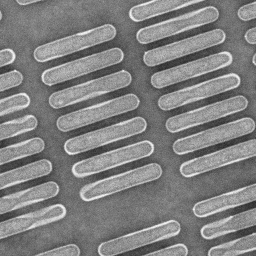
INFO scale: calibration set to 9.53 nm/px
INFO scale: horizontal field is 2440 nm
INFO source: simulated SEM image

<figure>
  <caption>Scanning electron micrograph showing groups of lines, slits or small figures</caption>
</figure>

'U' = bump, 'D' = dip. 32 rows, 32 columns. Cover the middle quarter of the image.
UUUUUUUUUUUDDDDDDDDDDDDDDDDDDUUU
UUUUUUUUDDDDDDDDDDDDDDDDDDUUUUUU
UUUUUDDDDDDDUUUUDDDDDDDUUUUUUUUU
UUDDDDDDDUUUUUUUUDDDDDUUUUUUUUUU
DDDDDDDUUUUUUUUUUDDDDDUUUUUUUDDD
DDDDUUUUUUUUUUUDDDDDDDDUUUDDDDDD
UUUUUUUUUUUUUDDDDDDDDDDDDDDDDDUU
UUUUUUUUDDDDDDDDDDDDDDDDDDUUUUUU
UUUUUDDDDDDDDDUUUUDDDDDDUUUUUUUU
UUUDDDDDDDDUUUUUUUUDDDDDUUUUUUUD
DDDDDDDDDUUUUUUUUUDDDDDDUUUUUDDD
DDDDUUUUUUUUUUUUUDDDDDDDDDDDDDDD
DUUUUUUUUUUUUUDDDDDDDDDDDDDDDDUU
UUUUUUUUUUUDDDDDDDUDDDDDDDDUUUUU
UUUUUUUUDDDDDDDDUUUUDDDDDDUUUUUU
UUUUUDDDDDDDUUUUUUUUDDDDDDUUUUUU
UUDDDDDDDUUUUUUUUUUUDDDDDDUUUDDD
DDDDDDUUUUUUUUUUUUDDDDDDDDDDDDDD
DDDUUUUUUUUUUUUDDDDDDDDDDDDDDDDU
DUUUUUUUUUUDDDDDDDDDUDDDDDDDUUUU
UUUUUUUUUDDDDDDDDUUUUUDDDDDDUUUU
DUUUUUDDDDDDDUUUUUUUUUDDDDDDUUUU
DDDDDDDDDDUUUUUUUUUUUUDDDDDDDDDD
DDDDDDDUUUUUUUUUUUUDDDDDDDDDDDDD
DDDDUUUUUUUUUUUUDDDDDDDDDDDDDDDD
DDDUUUUUUUUUUDDDDDDDUUUUDDDDDDUU
DDDUUUUUUUDDDDDDDDUUUUUUDDDDDUUU
DDDUUUDDDDDDDDDUUUUUUUUUDDDDDDUU
DDDDDDDDDDDDUUUUUUUUUUUDDDDDDDDD
DDDDDDDDDUUUUUUUUUUUDDDDDDDDDDDD
DDDDDDDUUUUUUUUUUDDDDDDDDDDDDDDD
DDDDDUUUUUUUUUDDDDDDDDDDDDDDDDDD